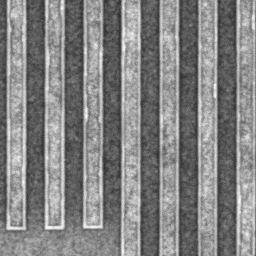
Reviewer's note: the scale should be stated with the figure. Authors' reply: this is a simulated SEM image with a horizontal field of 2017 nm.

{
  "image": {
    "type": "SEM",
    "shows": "parallel lines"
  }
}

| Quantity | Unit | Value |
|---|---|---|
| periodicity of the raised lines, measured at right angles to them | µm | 0.302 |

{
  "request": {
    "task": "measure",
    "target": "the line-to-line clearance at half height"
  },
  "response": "20.6 pixels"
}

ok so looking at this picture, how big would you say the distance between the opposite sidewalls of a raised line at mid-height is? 0.14 µm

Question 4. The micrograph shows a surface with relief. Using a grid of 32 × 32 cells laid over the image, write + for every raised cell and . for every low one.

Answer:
.++...++...++..++...++...++...++
.++...++...++..++...++...++...++
.++...++...++..++...++...++...++
.++...++...++..++...++...++...++
.++...++...++..++...++...++...++
.++...++...++..++...++...++...++
.++...++...++..++...++...++...++
.++...++...++..++...++...++...++
.++...++...++..++...++...++...++
.++...++...++..++...++...++...++
.++...++...++..++...++...++...++
.++...++...++..++...++...++...++
.++...++...++..++...++...++...++
.++...++...++..++...++...++...++
.++...++...++..++...++...++...++
.++...++...++..++...++...++...++
.++...++...++..++...++...++...++
.++...++...++..++...++...++...++
.++...++...++..++...++...++...++
.++...++...++..++...++...++...++
.++...++...++..++...++...++...++
.++...++...++..++...++...++...++
.++...++...++..++...++...++...++
.++...++...++..++...++...++...++
.++...++...++..++...++...++...++
.++...++...++..++...++...++...++
.++...++...++..++...++...++...++
.++...++...++..++...++...++...++
.++............++...++...++...++
...............++...++...++...++
...............++...++...++...++
...............++...++...++...++